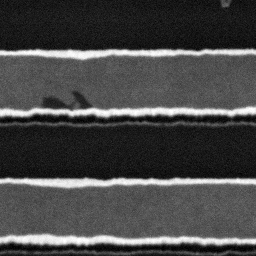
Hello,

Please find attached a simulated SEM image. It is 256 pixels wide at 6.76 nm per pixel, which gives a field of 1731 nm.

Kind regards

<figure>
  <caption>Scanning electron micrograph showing lines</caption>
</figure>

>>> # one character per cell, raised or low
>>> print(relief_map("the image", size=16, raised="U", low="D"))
DDDDDDDDDDDDDDDD
DDDDDDDDDDDDDDDD
DDDDDDDDDDDDDDDD
UUUUUUUUUUUUUUUU
UUUUUUUUUUUUUUUU
UUUUUUUUUUUUUUUU
UUUUUUUUUUUUUUUU
DDDDDDDDDDDDDDDD
DDDDDDDDDDDDDDDD
DDDDDDDDDDDDDDDD
DDDDDDDDDDDDDDDD
UUUUUUUUUUUUUUUU
UUUUUUUUUUUUUUUU
UUUUUUUUUUUUUUUU
UUUUUUUUUUUUUUUU
DDDDDDDDDDDDDDDD